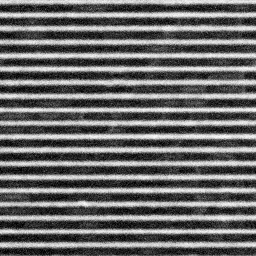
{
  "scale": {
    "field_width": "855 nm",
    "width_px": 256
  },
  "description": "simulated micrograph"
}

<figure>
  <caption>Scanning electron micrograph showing parallel lines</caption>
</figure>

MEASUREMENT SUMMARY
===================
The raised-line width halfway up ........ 12.9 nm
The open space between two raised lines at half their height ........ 32.9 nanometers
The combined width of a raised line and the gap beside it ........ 45.2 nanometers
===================